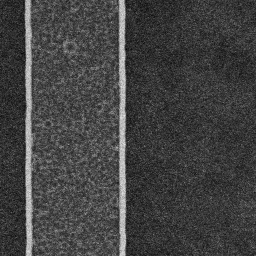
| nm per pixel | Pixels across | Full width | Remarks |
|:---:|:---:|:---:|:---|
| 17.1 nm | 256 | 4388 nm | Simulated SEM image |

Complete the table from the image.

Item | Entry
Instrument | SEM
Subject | one or a few lines or trenches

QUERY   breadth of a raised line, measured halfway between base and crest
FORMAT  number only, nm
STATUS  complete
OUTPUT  1610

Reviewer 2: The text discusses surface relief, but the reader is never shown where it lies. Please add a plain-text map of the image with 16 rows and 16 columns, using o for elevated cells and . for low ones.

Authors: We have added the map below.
..oooooo........
..oooooo........
..oooooo........
..oooooo........
..oooooo........
..oooooo........
..oooooo........
..oooooo........
..oooooo........
..oooooo........
..oooooo........
..oooooo........
..oooooo........
..oooooo........
..oooooo........
..oooooo........